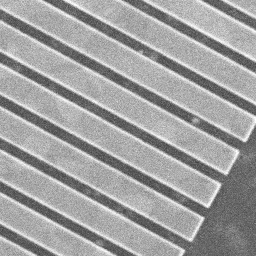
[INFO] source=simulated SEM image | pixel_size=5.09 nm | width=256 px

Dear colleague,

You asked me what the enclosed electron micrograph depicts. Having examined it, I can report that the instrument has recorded parallel lines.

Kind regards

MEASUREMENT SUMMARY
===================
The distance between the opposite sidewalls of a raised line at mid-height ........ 129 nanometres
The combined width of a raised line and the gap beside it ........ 190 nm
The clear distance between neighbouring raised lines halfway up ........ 0.0642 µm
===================